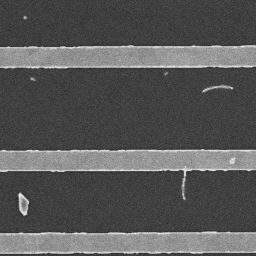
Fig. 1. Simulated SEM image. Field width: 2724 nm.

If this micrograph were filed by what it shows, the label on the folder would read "lines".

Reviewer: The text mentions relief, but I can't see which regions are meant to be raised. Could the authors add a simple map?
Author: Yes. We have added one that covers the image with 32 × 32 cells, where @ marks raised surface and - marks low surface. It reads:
--------------------------------
--------------------------------
--------------------------------
--------------------------------
--------------------------------
--------------------------------
@@@@@@@@@@@@@@@@@@@@@@@@@@@@@@@@
@@@@@@@@@@@@@@@@@@@@@@@@@@@@@@@@
--------------------------------
--------------------------------
--------------------------------
--------------------------------
--------------------------------
--------------------------------
--------------------------------
--------------------------------
--------------------------------
--------------------------------
--------------------------------
@@@@@@@@@@@@@@@@@@@@@@@@@@@@@@@@
@@@@@@@@@@@@@@@@@@@@@@@@@@@@@@@@
--------------------------------
--------------------------------
--------------------------------
--------------------------------
--@@----------------------------
--------------------------------
--------------------------------
--------------------------------
@@@@@@@@@@@@@@@@@@@@@@@@@@@@@@@@
@@@@@@@@@@@@@@@@@@@@@@@@@@@@@@@@
@@@@@@@@@@@@@@@@@@@@@@@@@@@@@@@@